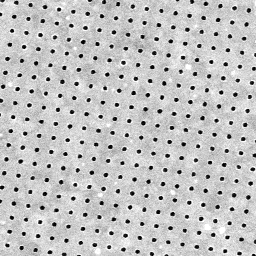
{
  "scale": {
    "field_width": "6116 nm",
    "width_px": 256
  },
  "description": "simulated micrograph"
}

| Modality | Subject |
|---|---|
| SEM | a regular array of holes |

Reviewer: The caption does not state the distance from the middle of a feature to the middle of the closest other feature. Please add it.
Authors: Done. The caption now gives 335 nanometers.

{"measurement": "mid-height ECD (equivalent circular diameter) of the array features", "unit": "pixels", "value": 4.92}